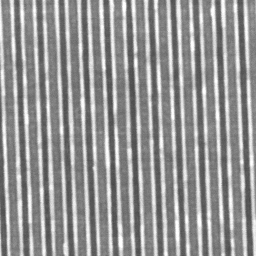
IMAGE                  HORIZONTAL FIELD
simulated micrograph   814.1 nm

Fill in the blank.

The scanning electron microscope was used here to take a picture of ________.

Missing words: parallel lines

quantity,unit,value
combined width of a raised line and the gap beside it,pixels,11.2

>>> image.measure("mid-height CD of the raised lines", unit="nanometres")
11.1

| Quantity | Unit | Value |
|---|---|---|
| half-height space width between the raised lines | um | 0.0222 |